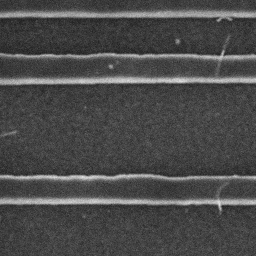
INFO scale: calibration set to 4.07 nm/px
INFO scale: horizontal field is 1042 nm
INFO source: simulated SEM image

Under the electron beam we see lines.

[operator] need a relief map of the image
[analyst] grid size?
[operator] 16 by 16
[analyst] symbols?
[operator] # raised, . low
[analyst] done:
################
................
................
##############.#
################
................
................
................
................
................
................
################
################
................
................
................